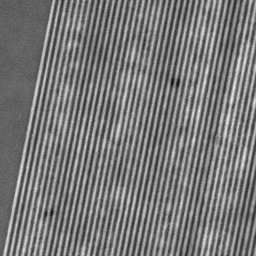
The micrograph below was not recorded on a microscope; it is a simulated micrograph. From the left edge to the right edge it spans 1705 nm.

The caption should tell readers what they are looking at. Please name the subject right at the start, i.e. parallel lines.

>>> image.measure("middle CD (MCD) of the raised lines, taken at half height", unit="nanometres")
13.1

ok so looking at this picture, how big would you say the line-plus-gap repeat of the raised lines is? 39 nm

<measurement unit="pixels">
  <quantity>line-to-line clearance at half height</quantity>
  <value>3.8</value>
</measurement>